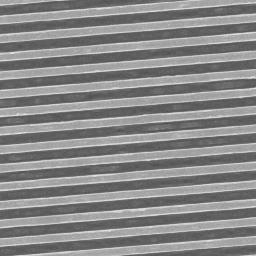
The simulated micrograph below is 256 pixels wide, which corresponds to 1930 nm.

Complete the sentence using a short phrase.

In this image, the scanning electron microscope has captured parallel lines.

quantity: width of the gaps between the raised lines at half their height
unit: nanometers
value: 77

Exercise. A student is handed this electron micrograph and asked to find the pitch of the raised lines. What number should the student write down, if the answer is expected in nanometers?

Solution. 139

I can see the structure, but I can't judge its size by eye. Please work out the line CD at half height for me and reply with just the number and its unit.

62.9 nanometres